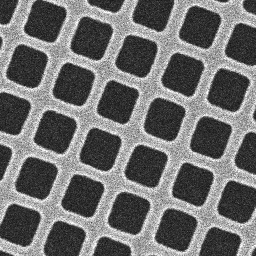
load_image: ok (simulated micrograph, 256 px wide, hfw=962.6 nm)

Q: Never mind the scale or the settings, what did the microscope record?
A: a regular array of holes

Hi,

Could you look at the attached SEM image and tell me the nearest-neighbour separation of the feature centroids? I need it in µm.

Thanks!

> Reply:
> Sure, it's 0.183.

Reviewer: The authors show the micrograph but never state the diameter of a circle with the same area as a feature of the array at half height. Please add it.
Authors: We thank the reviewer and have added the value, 155 nanometers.